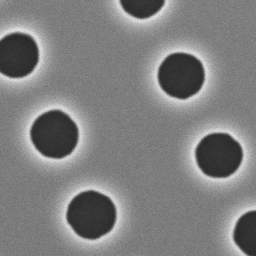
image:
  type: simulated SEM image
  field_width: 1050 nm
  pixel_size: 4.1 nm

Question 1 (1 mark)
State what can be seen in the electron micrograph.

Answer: holes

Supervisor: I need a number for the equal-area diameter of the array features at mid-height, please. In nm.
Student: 196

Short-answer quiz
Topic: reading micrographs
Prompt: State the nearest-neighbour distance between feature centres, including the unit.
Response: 362 nm